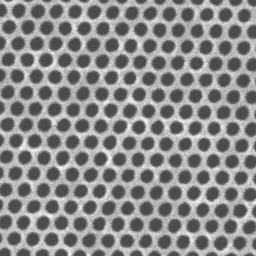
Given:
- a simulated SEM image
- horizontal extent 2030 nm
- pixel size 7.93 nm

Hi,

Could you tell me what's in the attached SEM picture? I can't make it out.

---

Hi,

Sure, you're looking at a regular array of holes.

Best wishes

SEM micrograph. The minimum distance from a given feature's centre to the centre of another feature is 147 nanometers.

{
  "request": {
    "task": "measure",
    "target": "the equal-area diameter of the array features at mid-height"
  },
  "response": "14.6 px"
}